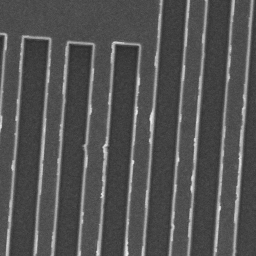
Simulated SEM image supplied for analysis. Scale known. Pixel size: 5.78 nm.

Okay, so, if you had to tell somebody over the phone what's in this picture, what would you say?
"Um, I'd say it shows parallel lines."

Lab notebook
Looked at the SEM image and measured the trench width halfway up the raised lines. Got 25.4 pixels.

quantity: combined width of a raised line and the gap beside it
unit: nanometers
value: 260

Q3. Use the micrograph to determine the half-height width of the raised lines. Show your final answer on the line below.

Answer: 112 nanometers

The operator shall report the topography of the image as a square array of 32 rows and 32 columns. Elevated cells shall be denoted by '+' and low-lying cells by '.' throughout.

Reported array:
++++++++++++++++++++....++...++.
++++++++++++++++++++...+++...++.
++++++++++++++++++++...+++...++.
++++++++++++++++++++...+++...++.
++++++++++++++++++++...+++...++.
.++...+++..++++.++++...+++...++.
+++...++....++...+++...++....++.
+++...++....++...+++...++....++.
+++...++...+++...+++...++...+++.
+++...++...+++...++....++...+++.
+++...++...+++...++....++...+++.
++....++...+++...++....++...+++.
++....++...+++...++....++...+++.
++....++...+++...++....++...+++.
++....++...+++...++....++...++..
++...+++...+++...++...+++...++..
++...+++...++....++...+++...++..
++...+++...++....++...+++...++..
++...+++...++....++...++....++..
++...+++...++....++...++....++..
++...++....++...+++...++....++..
++...++....++...+++...++....++..
++...++...+++...+++...++...+++..
++...++...+++...++....++...+++..
++...++...+++...++....++...+++..
+....++...+++...++....++...+++..
+....++...+++...++....++...+++..
+....++...+++...++....++...+++..
+....++...+++...++....++...++...
+...+++...+++...++...+++...++...
+...+++...++....++...+++...++...
+...+++...++....++...+++...++...